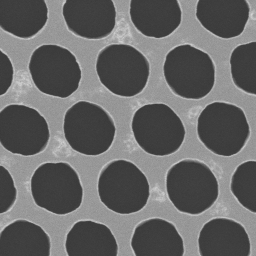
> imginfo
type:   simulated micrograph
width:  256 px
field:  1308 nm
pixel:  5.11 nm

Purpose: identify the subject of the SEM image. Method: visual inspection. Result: a regular array of holes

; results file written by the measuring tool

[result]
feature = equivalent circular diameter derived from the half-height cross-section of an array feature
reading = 266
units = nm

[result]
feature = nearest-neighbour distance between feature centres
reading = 341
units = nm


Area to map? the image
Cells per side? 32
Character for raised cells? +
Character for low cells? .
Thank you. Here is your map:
......++......++......+++......+
......++......++.......++......+
......++......+++......++......+
.....++++.....+++.....++++....++
++..++++++...+++++...++++++...++
++++++++++++++.+++++++++++++++..
++++.....++++....++++....++++...
.+++.....+++......+++.....+++...
..++......++.......+.......++...
..++......++.......++......++...
.+++......+++.....+++......++...
.++++....+++++...+++++....+++++.
++++++++++++++++++++++++++++++++
+...+++++....+++++...+++++....++
.....+++.....++++.....+++......+
......++......++.......++......+
......++......+++......++......+
......++......+++......++......+
+....++++.....++++....++++....++
++++++++++++++++++++++++++++++++
++++++..++++++...+++++...+++++..
.+++.....++++.....+++.....+++...
..++......++......+++......++...
..++......++.......++......++...
..++......++.......++......++...
..+++.....+++.....++++.....+++..
++++++...++++++..++++++..+++++++
+++++++++++++++++++.+++++++..+++
+....++++....++++.....+++.....++
......++......+++......++......+
......++.......+.......++......+
......++.......++......++......+